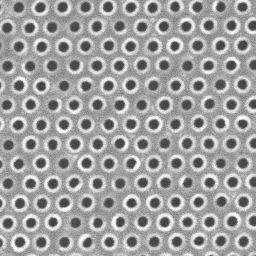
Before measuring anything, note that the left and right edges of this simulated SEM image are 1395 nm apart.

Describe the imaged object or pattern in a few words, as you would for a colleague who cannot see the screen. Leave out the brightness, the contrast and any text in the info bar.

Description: a regular array of holes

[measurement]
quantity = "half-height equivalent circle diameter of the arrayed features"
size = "56.7 nm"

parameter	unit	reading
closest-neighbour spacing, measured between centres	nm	119